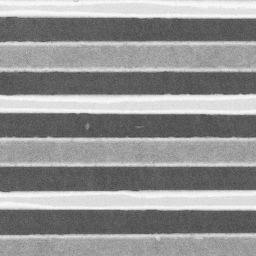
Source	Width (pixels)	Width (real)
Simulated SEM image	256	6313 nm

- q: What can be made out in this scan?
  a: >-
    lines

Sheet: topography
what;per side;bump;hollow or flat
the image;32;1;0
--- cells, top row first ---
11111111111111111111111111111111
11111111111111111111111111111111
00000000000000000000000000000000
00000000000000000000000000000000
00000000000000000000000000000000
11111111111111111111111111111111
11111111111111111111111111111111
11111111111111111111111111111111
11111111111111111111111111111111
00000000000000000000000000000000
00000000000000000000000000000000
00000000000000000000000000000000
11111111111111111111111111111111
11111111111111111111111111111111
00000000000000000000000000000000
00000000000000000000000000000000
00000000000000000000000000000000
11111111111111111111111111111111
11111111111111111111111111111111
11111111111111111111111111111111
11111111111111111111111111111111
00000000000000000000000000000000
00000000000000000000000000000000
00000000000000000000000000000000
11111111111111111111111111111111
11111111111111111111111111111111
00000000000000000000000000000000
00000000000000000000000000000000
00000000000000000000000000000000
11111111111111111111111111111111
11111111111111111111111111111111
11111111111111111111111111111111